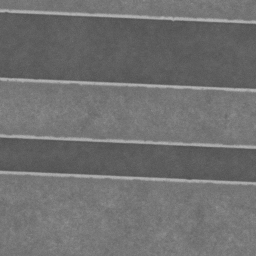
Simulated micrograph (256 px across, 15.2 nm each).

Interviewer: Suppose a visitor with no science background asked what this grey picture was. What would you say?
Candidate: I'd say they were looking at one or a few lines or trenches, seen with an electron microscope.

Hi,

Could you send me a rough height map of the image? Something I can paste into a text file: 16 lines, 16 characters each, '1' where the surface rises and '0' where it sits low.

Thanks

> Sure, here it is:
1111111111111111
0000000000000000
0000000000000000
0000000000000000
0000000000000000
1111111111110000
1111111111111111
1111111111111111
1111111111111111
0000000000000000
0000000000000000
1111111111111111
1111111111111111
1111111111111111
1111111111111111
1111111111111111